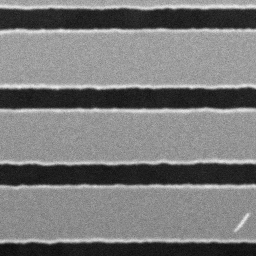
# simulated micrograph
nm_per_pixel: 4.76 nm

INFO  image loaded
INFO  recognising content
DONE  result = lines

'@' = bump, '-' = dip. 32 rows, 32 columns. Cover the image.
@@@@@@@@@@@@@@@@@@@@@@@@@@@@@@@@
--------------------------------
--------------------------------
--------------------------------
@@@@@@@@@@@@@@@@@@@@@@@@@@@@@@@@
@@@@@@@@@@@@@@@@@@@@@@@@@@@@@@@@
@@@@@@@@@@@@@@@@@@@@@@@@@@@@@@@@
@@@@@@@@@@@@@@@@@@@@@@@@@@@@@@@@
@@@@@@@@@@@@@@@@@@@@@@@@@@@@@@@@
@@@@@@@@@@@@@@@@@@@@@@@@@@@@@@@@
@@@@@@@@@@@@@@@@@@@@@@@@@@@@@@@@
--------------------------------
--------------------------------
--------------------------------
@@@@@@@@@@@@@@@@@@@@@@@@@@@@@@@@
@@@@@@@@@@@@@@@@@@@@@@@@@@@@@@@@
@@@@@@@@@@@@@@@@@@@@@@@@@@@@@@@@
@@@@@@@@@@@@@@@@@@@@@@@@@@@@@@@@
@@@@@@@@@@@@@@@@@@@@@@@@@@@@@@@@
@@@@@@@@@@@@@@@@@@@@@@@@@@@@@@@@
--@--@@-@@---@@-----------------
--------------------------------
--------------------------------
@@@@@@@@@@@@@@@@@@@@@@@@@@@@@@@@
@@@@@@@@@@@@@@@@@@@@@@@@@@@@@@@@
@@@@@@@@@@@@@@@@@@@@@@@@@@@@@@@@
@@@@@@@@@@@@@@@@@@@@@@@@@@@@@@@@
@@@@@@@@@@@@@@@@@@@@@@@@@@@@@@@@
@@@@@@@@@@@@@@@@@@@@@@@@@@@@@@@@
@@@@@@@@@@@@@@@@@@@@@@@@@@@@@@@@
--------------------------------
--------------------------------